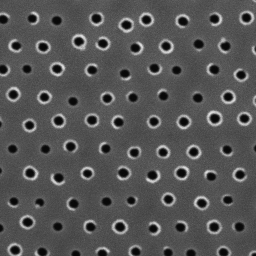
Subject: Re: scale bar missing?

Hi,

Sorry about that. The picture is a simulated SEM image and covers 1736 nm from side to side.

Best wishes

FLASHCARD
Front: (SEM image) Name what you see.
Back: a regular array of holes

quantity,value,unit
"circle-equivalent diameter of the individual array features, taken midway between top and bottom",9.57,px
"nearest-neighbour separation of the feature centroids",176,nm